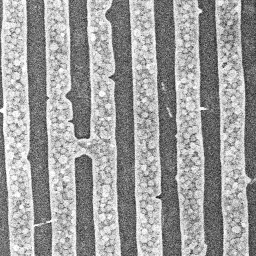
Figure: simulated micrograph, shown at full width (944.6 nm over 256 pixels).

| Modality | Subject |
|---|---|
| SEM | parallel lines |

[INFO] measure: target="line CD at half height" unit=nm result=90.9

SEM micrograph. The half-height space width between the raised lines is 0.0673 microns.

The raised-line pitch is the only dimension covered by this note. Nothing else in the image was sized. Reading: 0.159 µm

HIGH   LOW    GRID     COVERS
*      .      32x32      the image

***...***..***..***...***..***..
***...***..**...***...***..***..
***...***..**...***...***..***..
***...***..***..***...***..***..
***...***..***..***...***..***..
***...***..***..***...***..***..
***...***..***..***...***..***..
***...***..***..***...***..***..
***...***..***...***..***..***..
***...***..***...***..***..***..
***...***..***...***..***..****.
***...**...***...***..***..****.
****..***..***...***..***...***.
****..***..***...***..***...***.
****..***..***...***..***...***.
****..***..***...***..***...***.
****..***..***...***..***...***.
.***..********...***..***...**..
.***..********...***..***...**..
.**...****.****..***..***...***.
.***..***...***..***..****..***.
.***..***...***..***..***...***.
.***..***...**...***..***...***.
.***..***...***..***..***...***.
.***..***...***..***..***...***.
.***..***...***..***..***...***.
.***..***...***..***...**...***.
.***..***...***..***...**...***.
.***...**...***..***...**...***.
.***...**...***..***...**...***.
.***...**...***..***...***..***.
.***...***..***..***...***..***.